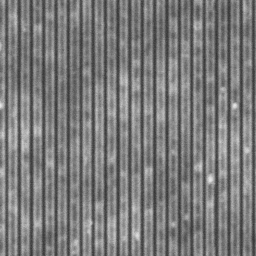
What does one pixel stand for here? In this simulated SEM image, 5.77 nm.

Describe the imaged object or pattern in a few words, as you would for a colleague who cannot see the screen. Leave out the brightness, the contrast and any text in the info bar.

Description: parallel lines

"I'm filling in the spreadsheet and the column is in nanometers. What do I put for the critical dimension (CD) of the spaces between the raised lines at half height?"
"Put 25.3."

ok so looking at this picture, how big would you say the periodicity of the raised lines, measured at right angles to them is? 71.3 nm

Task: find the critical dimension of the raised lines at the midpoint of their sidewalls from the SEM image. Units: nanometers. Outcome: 45.5